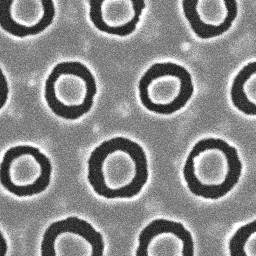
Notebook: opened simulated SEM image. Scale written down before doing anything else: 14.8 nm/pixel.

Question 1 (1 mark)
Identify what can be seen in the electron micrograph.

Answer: ring-shaped grooves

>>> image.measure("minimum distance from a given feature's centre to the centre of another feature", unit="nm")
1370